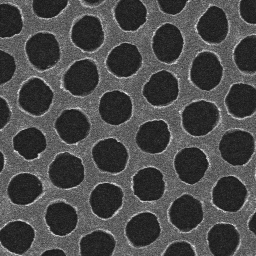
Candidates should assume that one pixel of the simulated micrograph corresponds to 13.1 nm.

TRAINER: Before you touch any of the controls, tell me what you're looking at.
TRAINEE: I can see a regular array of holes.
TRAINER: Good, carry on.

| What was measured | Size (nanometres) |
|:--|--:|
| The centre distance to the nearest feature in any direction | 604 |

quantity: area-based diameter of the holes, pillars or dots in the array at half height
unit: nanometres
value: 450